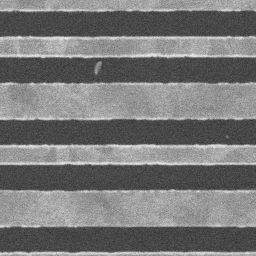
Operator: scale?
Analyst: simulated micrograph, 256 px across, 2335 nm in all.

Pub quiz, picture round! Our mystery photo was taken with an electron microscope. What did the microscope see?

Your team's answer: lines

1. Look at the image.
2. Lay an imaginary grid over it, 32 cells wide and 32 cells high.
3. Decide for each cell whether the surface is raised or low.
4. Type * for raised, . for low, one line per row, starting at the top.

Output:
********************************
................................
................................
................................
................................
********************************
********************************
................................
................................
................................
********.*.**.************.*****
********************************
********************************
********************************
********************************
................................
................................
................................
********************************
********************************
**.***.*........*...********..**
................................
................................
................................
********************************
********************************
********************************
********************************
................................
................................
................................
................................